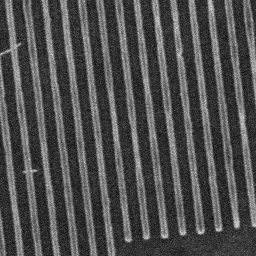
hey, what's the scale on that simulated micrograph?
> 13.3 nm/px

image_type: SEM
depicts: parallel lines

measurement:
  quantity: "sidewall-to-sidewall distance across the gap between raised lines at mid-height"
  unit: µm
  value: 0.174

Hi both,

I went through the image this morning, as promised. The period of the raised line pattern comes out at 242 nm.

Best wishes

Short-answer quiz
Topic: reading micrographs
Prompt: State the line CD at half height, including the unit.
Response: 5.22 px